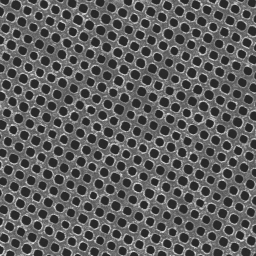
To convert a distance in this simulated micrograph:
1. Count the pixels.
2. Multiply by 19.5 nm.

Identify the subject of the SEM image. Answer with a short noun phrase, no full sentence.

a regular array of holes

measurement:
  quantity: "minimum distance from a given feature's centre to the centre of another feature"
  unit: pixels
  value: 12.4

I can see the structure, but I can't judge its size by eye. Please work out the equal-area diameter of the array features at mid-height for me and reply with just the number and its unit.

0.173 microns